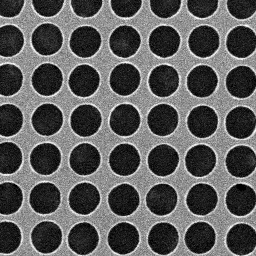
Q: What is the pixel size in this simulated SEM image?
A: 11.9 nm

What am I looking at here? a regular array of holes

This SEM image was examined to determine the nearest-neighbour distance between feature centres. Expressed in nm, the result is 456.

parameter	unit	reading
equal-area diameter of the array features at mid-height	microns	0.388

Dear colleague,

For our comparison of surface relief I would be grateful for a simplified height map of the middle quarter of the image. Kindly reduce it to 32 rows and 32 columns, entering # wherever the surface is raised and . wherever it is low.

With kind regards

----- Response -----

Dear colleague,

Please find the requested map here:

###....######.....#####....#####
##......####.......###......####
#........###.......##........##.
#........##........##........##.
#........##........##........#..
#........###.......##........##.
##......####......###.......###.
###....######....#####.....#####
########################.#######
################################
####....#####.....#####....#####
##.......###.......###......####
##.......###.......##.......###.
#.........#........##........##.
#........##........##........##.
##.......##........##.......###.
##.......###......####......###.
###.....#####....#####.....#####
################################
################################
###.....#####.....#####....#####
##.......###......####......###.
#........##........##........##.
#........##........##........#..
#........##........##........#..
#........##........##........#..
##......####......###.......###.
###....######....#####.....#####
################################
#####.##########################
###.....#####....#####.....#####
##.......###......###.......###.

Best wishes